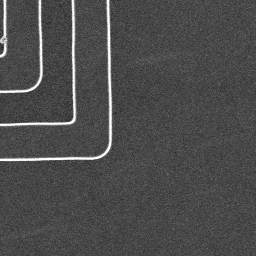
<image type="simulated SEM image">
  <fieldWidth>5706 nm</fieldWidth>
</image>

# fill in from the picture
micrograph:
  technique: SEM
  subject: groups of lines, slits or small figures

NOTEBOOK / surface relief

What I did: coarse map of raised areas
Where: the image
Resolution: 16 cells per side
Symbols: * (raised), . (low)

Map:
**...**.........
**...**.........
***..**.........
***..**.........
***..**.........
**...**.........
.....**.........
....***.........
*******.........
*******.........
................
................
................
................
................
................